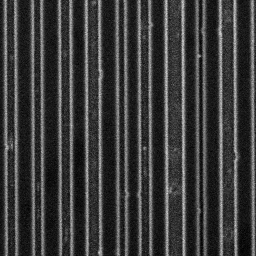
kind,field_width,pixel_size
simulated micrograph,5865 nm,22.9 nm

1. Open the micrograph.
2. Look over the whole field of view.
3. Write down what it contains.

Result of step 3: parallel lines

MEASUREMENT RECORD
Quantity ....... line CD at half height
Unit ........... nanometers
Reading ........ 367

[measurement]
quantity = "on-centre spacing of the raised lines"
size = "27.5 pixels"